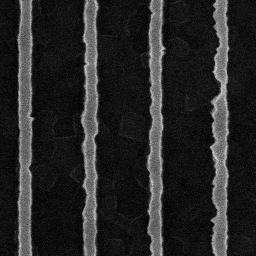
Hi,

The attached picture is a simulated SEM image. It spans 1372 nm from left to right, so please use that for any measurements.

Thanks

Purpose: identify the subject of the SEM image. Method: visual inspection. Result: one or a few lines or trenches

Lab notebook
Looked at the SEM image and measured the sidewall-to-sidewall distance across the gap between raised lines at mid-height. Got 286 nm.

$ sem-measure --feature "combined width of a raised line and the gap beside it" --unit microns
0.349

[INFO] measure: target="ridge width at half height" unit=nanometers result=63.6